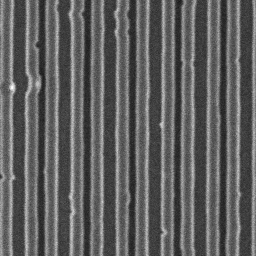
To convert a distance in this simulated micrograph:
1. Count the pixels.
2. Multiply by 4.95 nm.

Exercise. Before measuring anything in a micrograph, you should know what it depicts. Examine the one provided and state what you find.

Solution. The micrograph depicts parallel lines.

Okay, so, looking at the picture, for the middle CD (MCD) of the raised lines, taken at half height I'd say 54.4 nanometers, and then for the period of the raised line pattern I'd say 111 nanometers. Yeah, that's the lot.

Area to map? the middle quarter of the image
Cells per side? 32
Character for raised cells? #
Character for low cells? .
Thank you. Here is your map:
..###..###...###..###....##...##
..###..###...###..###....##...##
..###..###...###..###....##...##
..###..###...###..###....##...##
..###..###...###..###....##...##
..###..###...###..###....##...##
..###..###...###..###....##...##
..###..###...###..###....##...##
..###..###...###..###....##...##
..###..##....###..###....##...##
..###..##....###..###....##...##
..##...##....###..###....##...##
..##...##....###..###....##...##
..##...##....###..###....##...##
..##...##....###..###...###...##
..##...##....###..###...###...##
..##...##....###..###....##..###
..##...##....###..###....##..###
..##...##....###..###....##..###
..###..##....###..###....##..###
..###..##....###..###....##..###
..###..##....###..###....##...##
..###..##....###..###....##...##
..###..##....###..###....##...##
..##...##....###..###....##..###
..##...##....###..###....##..###
..##...##....###..###....##..###
..##...##....###..###....##..###
..###..##....###..###....##..###
..###..##....###..###....##..###
..###..##....###..###....##..###
..###..###...###..###....##...##